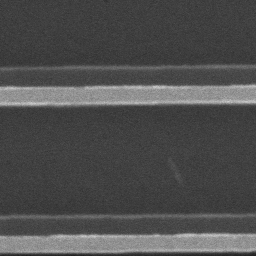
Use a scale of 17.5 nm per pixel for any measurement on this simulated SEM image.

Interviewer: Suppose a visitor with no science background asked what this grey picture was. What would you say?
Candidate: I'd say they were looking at lines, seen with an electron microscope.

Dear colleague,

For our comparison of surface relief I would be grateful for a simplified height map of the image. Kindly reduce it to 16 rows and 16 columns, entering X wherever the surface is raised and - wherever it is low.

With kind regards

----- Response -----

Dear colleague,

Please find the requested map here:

----------------
----------------
----------------
----------------
XXXXXXXXXXXXXXXX
XXXXXXXXXXXXXXXX
XXXXX-----------
----------------
----------------
----------------
----------------
----------------
----------------
----------------
XXXXXXXXXXXXXXXX
XXXXXXXXXXXXXXXX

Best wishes